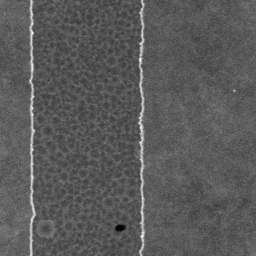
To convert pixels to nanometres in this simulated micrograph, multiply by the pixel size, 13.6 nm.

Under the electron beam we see one or a few lines or trenches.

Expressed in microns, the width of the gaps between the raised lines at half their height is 1.49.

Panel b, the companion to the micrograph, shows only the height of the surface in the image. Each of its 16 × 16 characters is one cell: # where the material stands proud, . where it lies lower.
##.......#######
##.......#######
##.......#######
##.......#######
##.......#######
##.......#######
##.......#######
##.......#######
##.......#######
##.......#######
##.......#######
##.......#######
##.......#######
##.......#######
###......#######
##.......#######